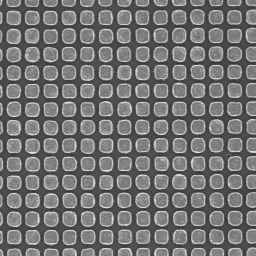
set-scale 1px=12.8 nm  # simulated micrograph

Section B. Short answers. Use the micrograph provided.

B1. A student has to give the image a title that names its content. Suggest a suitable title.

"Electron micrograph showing a regular array of raised bodies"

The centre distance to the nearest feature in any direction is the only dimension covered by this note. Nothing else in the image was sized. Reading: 229 nm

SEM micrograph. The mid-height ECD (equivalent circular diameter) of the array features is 192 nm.